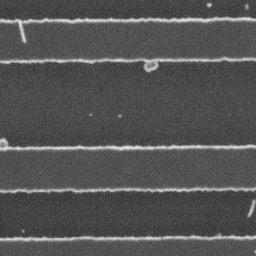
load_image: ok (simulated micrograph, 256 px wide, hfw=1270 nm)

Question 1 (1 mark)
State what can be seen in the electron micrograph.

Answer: lines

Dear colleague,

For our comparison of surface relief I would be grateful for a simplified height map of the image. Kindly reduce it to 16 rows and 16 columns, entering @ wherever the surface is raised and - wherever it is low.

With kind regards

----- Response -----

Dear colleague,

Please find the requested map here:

----------------
@@@@@@@@@@@@@@@@
@@@@@@@@@@@@@@@@
@@@@@@@@@@@@@@@@
----------------
----------------
----------------
----------------
----------------
@@@@@@@@@@@@@@@@
@@@@@@@@@@@@@@@@
@@@@@@@@@@@@@@@@
----------------
----------------
----------------
@@@@@@@@@@@@@@@@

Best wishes